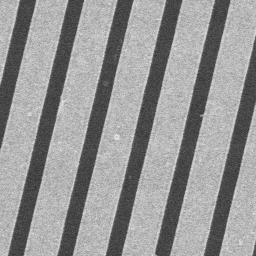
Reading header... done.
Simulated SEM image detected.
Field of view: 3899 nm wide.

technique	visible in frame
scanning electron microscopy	lines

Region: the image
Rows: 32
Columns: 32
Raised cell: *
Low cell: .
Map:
**...***..*****..****..****..***
**..****..****..****..****...***
**..****..****..****..****..****
**..****..****..****..****..****
*...***..*****..****..****..****
*..****..****..****...***...****
*..****..****..****..****..****.
*..****..****..****..****..****.
...***...****..****..****..****.
..****..****..****...****..****.
..****..****..****..****..****..
..****..****..****..****..****..
..****.*****..****..****..****..
.****..****...****..****..****..
.****..****..****..****..****...
.****..****..****..****..****..*
.****..****..****..****..****..*
****..*****..****..****..****..*
****..****..****..****...****..*
****..****..****..****..****..**
****..****..****..****..****..**
***...****..****..****..****..**
***..****..****..****...****..**
***..****..****..****..****..***
***..****..****..****..****..***
**...****..****..****..****..***
**..****..****...***...****..***
**..****..****..****..*****.****
**..****..****..****..****..****
*...****..****..****..****..****
*..****..*****..****..****..****
*..****..****..****..*****..****